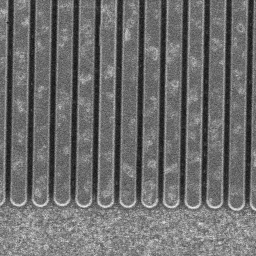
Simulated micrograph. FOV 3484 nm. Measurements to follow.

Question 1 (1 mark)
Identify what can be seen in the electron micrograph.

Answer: parallel lines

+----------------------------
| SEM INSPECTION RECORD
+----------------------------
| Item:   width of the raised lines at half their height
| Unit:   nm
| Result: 219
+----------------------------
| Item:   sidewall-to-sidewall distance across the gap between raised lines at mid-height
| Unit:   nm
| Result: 78.2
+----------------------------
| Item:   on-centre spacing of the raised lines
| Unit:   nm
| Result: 297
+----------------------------